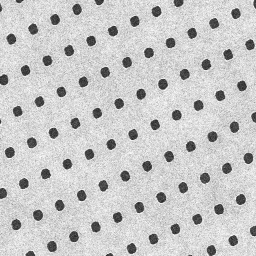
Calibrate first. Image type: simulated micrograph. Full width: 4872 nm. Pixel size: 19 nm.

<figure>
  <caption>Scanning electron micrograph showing a regular array of holes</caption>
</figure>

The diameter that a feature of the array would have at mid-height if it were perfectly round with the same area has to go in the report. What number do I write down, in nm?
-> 202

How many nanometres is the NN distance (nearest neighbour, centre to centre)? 453